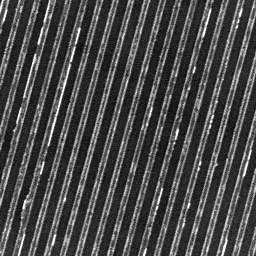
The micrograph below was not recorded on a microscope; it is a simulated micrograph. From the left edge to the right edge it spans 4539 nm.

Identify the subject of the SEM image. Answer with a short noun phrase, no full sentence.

parallel lines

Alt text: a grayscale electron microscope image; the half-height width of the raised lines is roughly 4.59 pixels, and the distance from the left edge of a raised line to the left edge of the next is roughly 269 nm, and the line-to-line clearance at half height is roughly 178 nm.